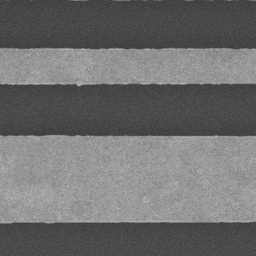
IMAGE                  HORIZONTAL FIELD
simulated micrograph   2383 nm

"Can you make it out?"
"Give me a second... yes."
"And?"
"lines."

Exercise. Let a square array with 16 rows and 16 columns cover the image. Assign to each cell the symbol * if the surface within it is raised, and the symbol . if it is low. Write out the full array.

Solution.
................
................
................
****************
****************
................
................
................
*****..*.*...*..
****************
****************
****************
****************
****************
................
................